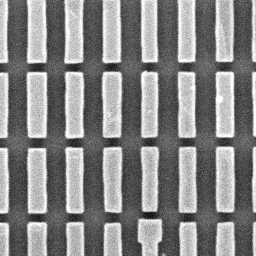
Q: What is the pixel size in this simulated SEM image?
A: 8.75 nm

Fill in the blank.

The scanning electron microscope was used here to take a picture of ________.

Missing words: wiring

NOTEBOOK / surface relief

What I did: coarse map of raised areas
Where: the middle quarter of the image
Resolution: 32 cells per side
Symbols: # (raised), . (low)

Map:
................................
................................
.###......####......###......###
.####.....####......###......###
.####.....####......###......###
.####.....####......###......###
.####.....####......###......###
.####.....####......###......###
.####.....####......###......###
.####.....####......###......###
.####.....####......###......###
.####.....####......###......###
.####.....####......###......###
.####.....####......###......###
.####.....####......###......###
.####.....####......###......###
.####.....####......###......###
.####.....####......###......###
................................
................................
................................
.####.....####.....####......###
.####.....####.....####......###
.####.....####.....####......###
.####.....####......###......###
.####.....####......###......###
.####.....####......###......###
.####.....####......###......###
.####.....####......###......###
.####.....####......###......###
.####.....####......###......###
.####.....####......###......###